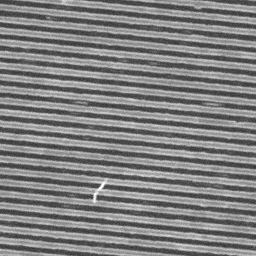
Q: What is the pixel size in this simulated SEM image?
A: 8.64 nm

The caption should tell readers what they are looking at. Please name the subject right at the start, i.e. parallel lines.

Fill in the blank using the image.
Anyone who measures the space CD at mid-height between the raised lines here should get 52.6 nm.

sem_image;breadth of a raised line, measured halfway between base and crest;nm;45.1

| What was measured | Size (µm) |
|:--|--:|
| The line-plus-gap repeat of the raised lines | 0.1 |